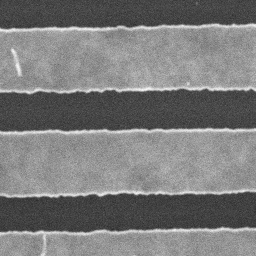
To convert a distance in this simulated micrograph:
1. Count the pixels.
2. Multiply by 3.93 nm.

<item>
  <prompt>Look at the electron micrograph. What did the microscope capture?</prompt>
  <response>lines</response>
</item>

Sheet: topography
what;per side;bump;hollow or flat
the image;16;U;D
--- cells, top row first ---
DDDDDDDDDDDDDDDD
DDDDDDDDDDDDDDDD
UUUUUUUUUUUUUUUU
UUUUUUUUUUUUUUUU
UUUUUUUUUUUUUUUU
UUUUUUUUUUUUUUUU
DDDDDDDDDDDDDDDD
DDDDDDDDDDDDDDDD
UUUUUUUUUUUUUUUU
UUUUUUUUUUUUUUUU
UUUUUUUUUUUUUUUU
UUUUUUUUUUUUUUUU
DDDDDDDDDDDDDDDD
DDDDDDDDDDDDDDDD
UUUUDUUUUUUUUUUU
UUUUUUUUUUUUUUUU